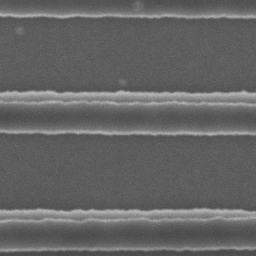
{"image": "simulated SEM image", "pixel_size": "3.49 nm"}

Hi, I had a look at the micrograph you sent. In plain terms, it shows lines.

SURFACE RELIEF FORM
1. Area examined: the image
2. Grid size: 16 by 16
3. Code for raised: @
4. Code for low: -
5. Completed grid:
@@@@@@@@@@@@@@@@
----------------
----------------
----------------
----------------
----------------
@@@@@@@@@@@@@@@@
@@@@@@@@@@@@@@@@
----------------
----------------
----------------
----------------
----------------
@@@@@@@@@@@@@@@@
@@@@@@@@@@@@@@@@
@@@@@@@@@@@@@@@@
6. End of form